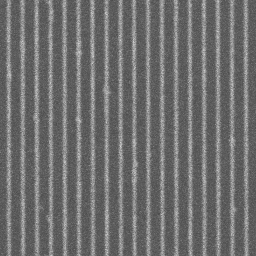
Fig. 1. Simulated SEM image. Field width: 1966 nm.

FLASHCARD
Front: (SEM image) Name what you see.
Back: parallel lines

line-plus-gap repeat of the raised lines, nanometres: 107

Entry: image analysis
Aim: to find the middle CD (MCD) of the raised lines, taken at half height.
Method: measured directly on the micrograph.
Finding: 27.8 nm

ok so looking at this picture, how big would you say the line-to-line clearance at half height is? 0.0845 um